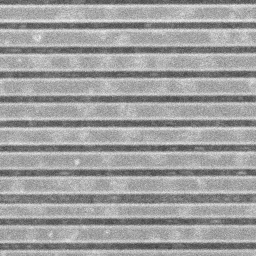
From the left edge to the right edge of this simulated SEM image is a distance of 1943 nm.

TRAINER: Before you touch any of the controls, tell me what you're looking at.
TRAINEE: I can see parallel lines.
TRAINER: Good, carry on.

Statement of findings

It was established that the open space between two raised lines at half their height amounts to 58.9 nm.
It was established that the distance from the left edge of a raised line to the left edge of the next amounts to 186 nanometres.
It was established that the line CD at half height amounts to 125 nanometers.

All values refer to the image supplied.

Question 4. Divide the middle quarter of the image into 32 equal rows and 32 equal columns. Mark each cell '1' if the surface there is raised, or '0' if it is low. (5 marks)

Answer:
11111111111111111111111111111111
00000000001000000000000000000000
00000000000000000000000000000000
00000000000000000000000000000000
11111111111111111111111111111111
11111111111111111111111111111111
11111111111111111111111111111111
11111111111111111111111111111111
00000000000000000000000000000000
00000000000000000000000000000000
11111111111111111111111111111111
11111111111111111111111111111111
11111111111111111111111111111111
11111111111111111111111111111111
00000000000000000000000000000000
00000000000000000000000000000000
11111111111111111111111111111111
11111111111111111111111111111111
11111111111111111111111111111111
11111111111111111111111111111111
00000000000000000000000000000000
00000000000000000000000000000000
11111111111111111111111111111111
11111111111111111111111111111111
11111111111111111111111111111111
11111111111111111111111111111111
00000000000000000000000000000000
00000000000000000000000000000000
11111111111111111111111111111111
11111111111111111111111111111111
11111111111111111111111111111111
11111111111111111111111111111111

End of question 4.